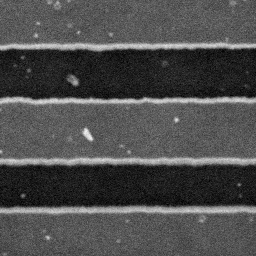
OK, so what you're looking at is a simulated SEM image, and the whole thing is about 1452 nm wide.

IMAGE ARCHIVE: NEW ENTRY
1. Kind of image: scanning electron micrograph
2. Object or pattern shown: lines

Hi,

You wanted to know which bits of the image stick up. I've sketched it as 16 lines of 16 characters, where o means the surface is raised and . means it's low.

oooooooooooooooo
oooooooooooooooo
oooooooooooooooo
................
................
................
oooooooooooooooo
oooooooooooooooo
oooooooooooooooo
oooooooooooooooo
................
................
................
oooooooooooooooo
oooooooooooooooo
oooooooooooooooo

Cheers